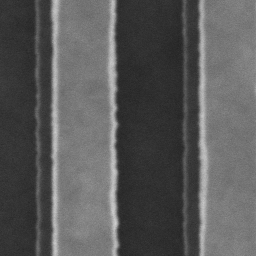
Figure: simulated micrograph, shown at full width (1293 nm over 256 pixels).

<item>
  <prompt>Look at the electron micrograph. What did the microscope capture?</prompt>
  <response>lines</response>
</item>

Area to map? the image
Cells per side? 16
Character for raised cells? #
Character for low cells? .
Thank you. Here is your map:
...####.....####
...####.....####
...####.....####
...####.....####
...####......###
...####.....####
...####......###
...####.....####
...####.....####
...####.....####
...####......###
...####......###
...####.....####
...####......###
...####......###
...####......###